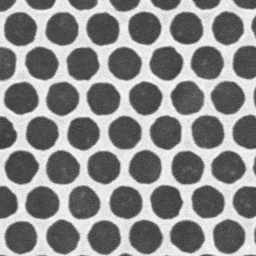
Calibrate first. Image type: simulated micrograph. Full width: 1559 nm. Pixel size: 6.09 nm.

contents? a regular array of holes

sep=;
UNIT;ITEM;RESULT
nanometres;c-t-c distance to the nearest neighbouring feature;244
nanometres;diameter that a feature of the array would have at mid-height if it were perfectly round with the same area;207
